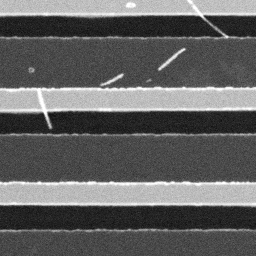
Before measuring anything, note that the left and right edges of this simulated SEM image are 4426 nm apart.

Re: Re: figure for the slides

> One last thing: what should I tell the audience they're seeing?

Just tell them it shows lines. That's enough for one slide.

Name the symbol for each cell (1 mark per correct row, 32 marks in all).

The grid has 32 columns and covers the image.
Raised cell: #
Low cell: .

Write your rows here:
################################
################################
................................
................................
................................
################################
################################
################################
################################
################################
################################
################################
################################
################################
................................
................................
................................
################################
################################
################################
################################
################################
################################
################################
################################
################################
................................
................................
................................
################################
################################
################################